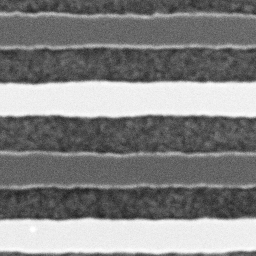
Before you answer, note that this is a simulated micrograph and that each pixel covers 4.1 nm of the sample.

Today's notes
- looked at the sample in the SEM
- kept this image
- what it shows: lines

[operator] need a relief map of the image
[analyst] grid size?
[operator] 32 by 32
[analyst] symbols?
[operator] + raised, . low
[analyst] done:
................................
................................
++++++++++++++++++++++++++++++++
++++++++++++++++++++++++++++++++
++++++++++++++++++++++++++++++++
++++++++++++++++++++++++++++++++
................................
................................
................................
................................
.+....++++++++++++++++++++++++++
++++++++++++++++++++++++++++++++
++++++++++++++++++++++++++++++++
++++++++++++++++++++++++++++++++
+.+.....+++++++++...........++++
................................
................................
................................
................................
++++++++++++++++++++++++++++++++
++++++++++++++++++++++++++++++++
++++++++++++++++++++++++++++++++
++++++++++++++++++++++++++++++++
..+.............................
................................
................................
................................
+++++++.++++++.++++.++++++++++++
++++++++++++++++++++++++++++++++
++++++++++++++++++++++++++++++++
++++++++++++++++++++++++++++++++
...+++++..++++..+.+++.++++++....